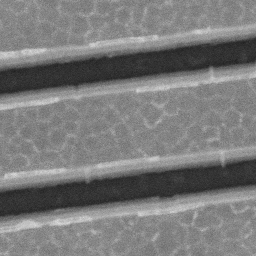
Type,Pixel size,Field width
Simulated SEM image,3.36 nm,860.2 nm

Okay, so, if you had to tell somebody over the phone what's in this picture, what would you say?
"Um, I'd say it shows one or a few lines or trenches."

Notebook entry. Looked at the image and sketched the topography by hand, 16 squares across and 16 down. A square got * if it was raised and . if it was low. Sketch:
****************
****************
***********.....
**..............
................
........********
****************
****************
****************
***************.
*******.........
................
.............***
.....***********
****************
****************